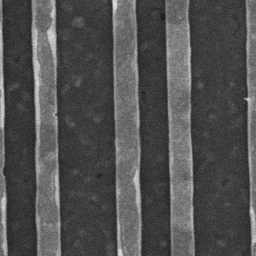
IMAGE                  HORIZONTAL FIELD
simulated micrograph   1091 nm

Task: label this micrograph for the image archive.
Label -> one or a few lines or trenches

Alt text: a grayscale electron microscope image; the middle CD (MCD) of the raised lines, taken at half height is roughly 0.0947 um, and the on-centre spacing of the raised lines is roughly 284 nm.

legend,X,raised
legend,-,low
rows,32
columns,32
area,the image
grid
----XXX-------XXX----XXX-------X
----XXX-------XXX----XX--------X
----XXX-------XXX----XXX-------X
----XXX-------XXX----XXX-------X
----XXX-------XXX----XXX-------X
----XXX-------XXX----XXX-------X
----XXX-------XXX----XXX-------X
----XXX-------XXX----XXX-------X
----XXX-------XXX----XXX-------X
----XXX-------XXX----XXX-------X
----XXX-------XXX----XXX-------X
----XXX-------XXX----XXX-------X
----XXX-------XXX----XXX-------X
X---XXX-------XXX----XXX-------X
X----XX-------XXX----XXX-------X
X----XX-------XXX----XXX-------X
-----XX-------XXX----XXX-------X
-----XX--------XX----XXX-------X
-----XX--------XX----XXX-------X
-----XX--------XX----XXX-------X
X----XX--------XX----XXX-------X
-----XX--------XX----XXX-------X
X----XX--------XX----XXX-------X
X----XX--------XX----XXX-------X
X----XX--------XX----XXX-------X
X----XX--------XX----XXX-------X
X----XX--------XX----XXX-------X
X----XX--------XXX---XXX-------X
X----XX--------XXX---XXX-------X
X----XX--------XX----XXX-------X
X----XX--------XX----XXX--------
X----XXX-------XX-----XX--------